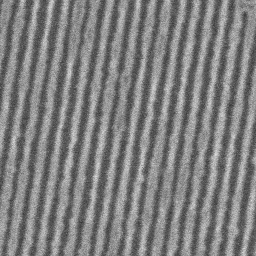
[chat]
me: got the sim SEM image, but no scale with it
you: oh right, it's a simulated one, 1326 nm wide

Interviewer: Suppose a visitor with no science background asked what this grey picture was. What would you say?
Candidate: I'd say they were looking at parallel lines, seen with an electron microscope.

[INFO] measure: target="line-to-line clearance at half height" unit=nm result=47.9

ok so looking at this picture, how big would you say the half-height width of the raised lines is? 0.0263 um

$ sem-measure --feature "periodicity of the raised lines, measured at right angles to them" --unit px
14.4